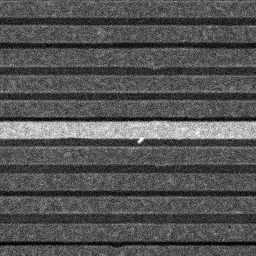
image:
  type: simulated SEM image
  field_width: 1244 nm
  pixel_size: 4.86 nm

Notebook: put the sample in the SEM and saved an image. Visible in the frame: parallel lines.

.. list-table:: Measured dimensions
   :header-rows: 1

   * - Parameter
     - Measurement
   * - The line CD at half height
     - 80.2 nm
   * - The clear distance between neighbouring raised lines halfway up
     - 0.0401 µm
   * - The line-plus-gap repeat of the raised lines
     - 0.121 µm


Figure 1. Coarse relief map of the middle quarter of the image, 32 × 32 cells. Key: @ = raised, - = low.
@@@@@@@@@@@@@@@@@@@@@@@@@@@@@@@@
--------------------------------
--------------------------------
@@@@@@@@@@@@@@@@@@@@@@@@@@@@@@@@
@@@@@@@@@@@@@@@@@@@@@@@@@@@@@@@@
@@@@@@@@@@@@@@@@@@@@@@@@@@@@@@@@
@@@@@@@@@@@@@@@@@@@@@@@@@@@@@@@@
--------------------------------
--------------------------------
@@@@@@@@@@@@@@@@@@@@@@@@@@@@@@@@
@@@@@@@@@@@@@@@@@@@@@@@@@@@@@@@@
@@@@@@@@@@@@@@@@@@@@@@@@@@@@@@@@
@@@@@@@@@@@@@@@@@@@@@@@@@@@@@@@@
--------------------------------
------------------@@--@@@@------
@@@@@@@@@@@@@@@@@@@@@@@@@@@@@@@@
@@@@@@@@@@@@@@@@@@@@@@@@@@@@@@@@
@@@@@@@@@@@@@@@@@@@@@@@@@@@@@@@@
-------------------@--------@@--
--------------------------------
--------------------------------
@@@@@@@@@@@@@@@@@@@@@@@@@@@@@@@@
@@@@@@@@@@@@@@@@@@@@@@@@@@@@@@@@
@@@@@@@@@@@@@@@@@@@@@@@@@@@@@@@@
@@@@@@@@@@@@@@@@@@@@@@@@@@@@@@@@
--------------------------------
--------------------------------
@@@@@@@@@@@@@@@@@@@@@@@@@@@@@@@-
@@@@@@@@@@@@@@@@@@@@@@@@@@@@@@@@
@@@@@@@@@@@@@@@@@@@@@@@@@@@@@@@@
@@@@@@@@@@@@@@@@@@@@@@@@@@@@@@@@
@@@@@@@@@-@@@@@@@@@@@@@@@@@@@@@@